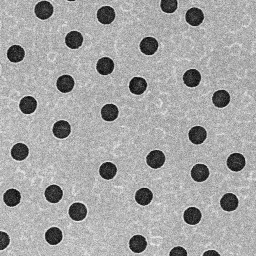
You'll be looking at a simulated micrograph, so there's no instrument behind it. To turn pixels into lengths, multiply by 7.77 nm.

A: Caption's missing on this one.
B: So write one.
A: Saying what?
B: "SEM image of a regular array of holes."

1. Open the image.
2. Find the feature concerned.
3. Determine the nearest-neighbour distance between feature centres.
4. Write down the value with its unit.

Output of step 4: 304 nanometers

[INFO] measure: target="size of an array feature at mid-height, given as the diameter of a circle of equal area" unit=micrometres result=0.147